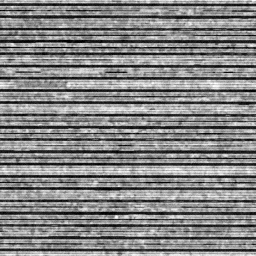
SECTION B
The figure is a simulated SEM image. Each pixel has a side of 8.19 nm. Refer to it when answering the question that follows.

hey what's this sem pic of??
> parallel lines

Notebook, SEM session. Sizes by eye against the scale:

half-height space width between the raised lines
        0.0276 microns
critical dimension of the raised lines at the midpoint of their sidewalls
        27.6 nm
